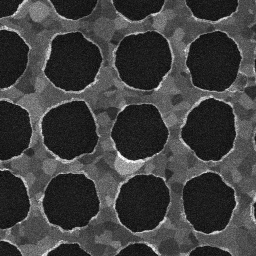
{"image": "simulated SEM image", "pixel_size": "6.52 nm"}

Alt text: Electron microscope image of a regular array of holes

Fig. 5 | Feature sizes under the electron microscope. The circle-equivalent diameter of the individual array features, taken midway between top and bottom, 375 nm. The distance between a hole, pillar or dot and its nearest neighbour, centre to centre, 0.447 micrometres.